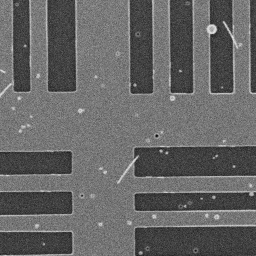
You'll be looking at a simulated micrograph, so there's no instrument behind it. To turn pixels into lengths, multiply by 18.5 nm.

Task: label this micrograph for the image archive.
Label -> groups of lines, slits or small figures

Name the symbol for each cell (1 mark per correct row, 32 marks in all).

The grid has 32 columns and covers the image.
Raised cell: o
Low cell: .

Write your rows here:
oo..oo...ooooooo...oo...oo...oo.
oo..oo...ooooooo...oo...oo...oo.
oo..oo...ooooooo...oo...oo...oo.
oo..oo....oooooo...oo...ooo..oo.
oo..oo....oooooo...oo...oo...oo.
oo..oo....oooooo...oo...oo...oo.
oo..oo....oooooo...oo...oo...oo.
oo..oo....oooooo...oo...oo...oo.
oo..oo....oooooo...oo...oo...oo.
oo..oo....oooooo...oo...oo...oo.
oo..oo....oooooo...oo...oo...oo.
oo.ooo...ooooooo...oo...oo...ooo
oooooooooooooooooooooooooooooooo
oooooooooooooooooooooooooooooooo
oooooooooooooooooooooooooooooooo
oooooooooooooooooooooooooooooooo
oooooooooooooooooooooooooooooooo
oooooooooooooooooooooooooooooooo
ooooooooooooooooo...............
.........oooooooo...............
.........oooooooo...............
.........oooooooo...............
oooooooooooooooooooooooooooooooo
oooooooooooooooooooooooooooooooo
.........oooooooo...............
.........oooooooo...............
.........ooooooooooooooooooooooo
oooooooooooooooooooooooooooooooo
ooooooooooooooooo...............
.........oooooooo...............
.........oooooooo...............
.........oooooooo...............